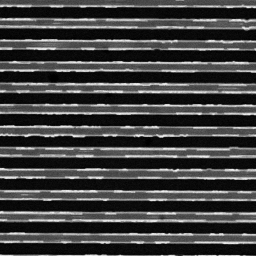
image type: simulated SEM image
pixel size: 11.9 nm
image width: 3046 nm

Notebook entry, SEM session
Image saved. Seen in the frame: parallel lines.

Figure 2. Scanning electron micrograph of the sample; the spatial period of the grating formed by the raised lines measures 255 nm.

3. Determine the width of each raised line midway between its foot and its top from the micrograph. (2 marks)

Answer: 109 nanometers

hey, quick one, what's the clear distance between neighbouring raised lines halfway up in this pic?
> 141 nm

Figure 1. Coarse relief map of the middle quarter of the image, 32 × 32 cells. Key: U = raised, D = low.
UUUUUUUUUUUUUUUUUUUUUUUUUUUUUUUU
UUUUUUUUUUUUUUUUUUUUUUUUUUUUUUUU
DDDDDDDDDDDDDDDDDDDDDDDDDDDDDDDD
DDDDDDDDDDDDDDDDDDDDDDDDDDDDDDDD
DDDDDDDDDDDDDDDDDDDDDDDDDDDDDDDD
UUUUUUUUUUUUUUUUUUUUUUUUUUUUUUUU
UUUUUUUUUUUUUUUUUUUUUUUUUUUUUUUU
DDDDDDDDDDDDDDDDDDDDDDDDDDDDDDDD
DDDDDDDDDDDDDDDDDDDDDDDDDDDDDDDD
DDDDDDDDDDDDDDDDDDDDDDDDDDDDDDDD
UUUUUUUUUUUUUUUUUUUUUUUUUUUUUUUU
UUUUUUUUUUUUUUUUUUUUUUUUUUUUUUUU
UDUUDUUDDDDDDUUUUDDDDDDDDDDDUDDD
DDDDDDDDDDDDDDDDDDDDDDDDDDDDDDDD
DDDDDDDDDDDDDDDDDDDDDDDDDDDDDDDD
DDDDDDDDDDDDDDDDDDDDDDDDDDDDDDDD
UUUUUUUUUUUUUUUUUUUUUUUUUUUUUUUU
UUUUUUUUUUUUUUUUUUUUUUUUUUUUUUUU
DDDDDDDDDDDDDDDDDDDDDDDDDDDDDDDD
DDDDDDDDDDDDDDDDDDDDDDDDDDDDDDDD
DDDDDDDDDDDDDDDDDDDDDDDDDDDDDDDD
UUUUUUUUUUUUUUUUUUUUUUUUUUUUUUUU
UUUUUUUUUUUUUUUUUUUUUUUUUUUUUUUU
DDDDDDDDDDDDDDDDDDDDDDDDDDDDDDDD
DDDDDDDDDDDDDDDDDDDDDDDDDDDDDDDD
DDDDDDDDDDDDDDDDDDDDDDDDDDDDDDDD
UUUUUUUUUUUUUUUUUUUUUUUUUUUDUDDU
UUUUUUUUUUUUUUUUUUUUUUUUUUUUUUUU
DUUDDDUDUUDDDDDDDDDDDUUUUUUUUUUU
DDDDDDDDDDDDDDDDDDDDDDDDDDDDDDDD
DDDDDDDDDDDDDDDDDDDDDDDDDDDDDDDD
DDDDDDDDDDDDDDDDDDDDDDDDDDDDDDDD